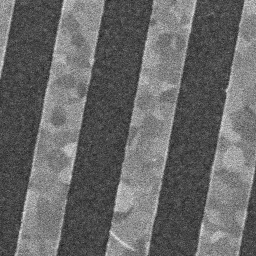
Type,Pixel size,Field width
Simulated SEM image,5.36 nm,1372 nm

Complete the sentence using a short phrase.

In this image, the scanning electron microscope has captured one or a few lines or trenches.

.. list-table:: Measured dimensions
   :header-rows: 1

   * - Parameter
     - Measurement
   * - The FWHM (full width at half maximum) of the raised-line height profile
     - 217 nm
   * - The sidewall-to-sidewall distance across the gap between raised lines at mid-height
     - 0.263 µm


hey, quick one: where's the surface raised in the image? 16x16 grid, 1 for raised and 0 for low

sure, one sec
1000110000110001
1000110001110001
0000110001110001
0001110001110001
0001110001100011
0001100001100011
0001100011100011
0001100011100011
0011100011100011
0011100011000011
0011100011000111
0011000111000111
0011000111000111
0111000111000110
0111000110000110
0111000110001110